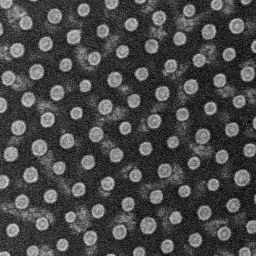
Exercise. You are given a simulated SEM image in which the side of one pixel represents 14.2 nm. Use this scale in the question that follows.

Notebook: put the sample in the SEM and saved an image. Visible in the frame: a regular array of raised bodies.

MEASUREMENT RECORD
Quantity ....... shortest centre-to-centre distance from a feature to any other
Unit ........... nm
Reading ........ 405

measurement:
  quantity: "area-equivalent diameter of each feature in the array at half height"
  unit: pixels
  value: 11.8